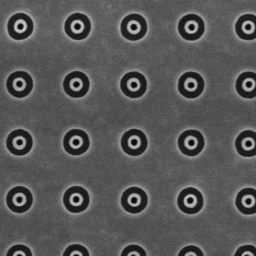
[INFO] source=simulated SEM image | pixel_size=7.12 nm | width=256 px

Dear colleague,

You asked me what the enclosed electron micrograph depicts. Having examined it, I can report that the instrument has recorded a regular array of ring-shaped grooves with a dot in the middle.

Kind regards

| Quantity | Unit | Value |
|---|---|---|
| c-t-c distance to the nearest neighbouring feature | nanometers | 404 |